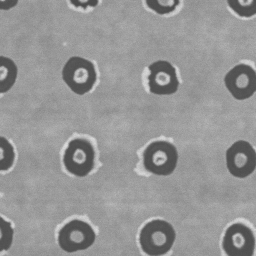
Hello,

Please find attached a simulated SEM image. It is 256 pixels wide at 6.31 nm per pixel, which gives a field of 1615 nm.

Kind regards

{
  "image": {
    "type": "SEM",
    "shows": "ring-shaped grooves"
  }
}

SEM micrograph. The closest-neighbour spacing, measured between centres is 499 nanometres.